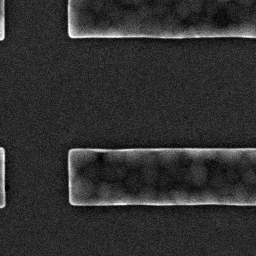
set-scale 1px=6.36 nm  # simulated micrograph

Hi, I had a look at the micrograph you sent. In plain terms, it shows wiring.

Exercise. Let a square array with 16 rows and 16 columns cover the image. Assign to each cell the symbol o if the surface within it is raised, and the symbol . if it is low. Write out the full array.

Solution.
....oooooooooooo
....oooooooooooo
................
................
................
................
................
................
................
.....o.ooooooooo
....oooooooooooo
....oooooooooooo
....oooooooooooo
................
................
................